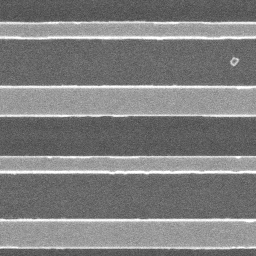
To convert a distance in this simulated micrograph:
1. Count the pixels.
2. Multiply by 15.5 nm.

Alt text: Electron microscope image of lines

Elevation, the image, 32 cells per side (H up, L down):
LLLLLLLLLLLLLLLLLLLLLLLLLLLLLLLL
LLLLLLLLLLLLLLLLLLLLLLLLLLLLLLLL
LLLLLLLLLLLLLLLLLLLLLLLLLLLLLLLL
HHHHHHHHHHHHHHHHHHHHHHHHHHHHHHHH
HHHHHHHHHHHHHHHHHHHHHHHHHHHHHHHH
LLLLLLLLLLLLLLLLLLLLLLLLLLLLLLLL
LLLLLLLLLLLLLLLLLLLLLLLLLLLLLLLL
LLLLLLLLLLLLLLLLLLLLLLLLLLLLLLLL
LLLLLLLLLLLLLLLLLLLLLLLLLLLLLLLL
LLLLLLLLLLLLLLLLLLLLLLLLLLLLLLLL
LLLLLLLLLLLLLLLLLLLLLLLLLLLLLLLL
HHHHHHHHHHHHHHHHHHHHHHHHHHHHHHHH
HHHHHHHHHHHHHHHHHHHHHHHHHHHHHHHH
HHHHHHHHHHHHHHHHHHHHHHHHHHHHHHHH
LLLLLLLHHLLLLLHLLLLLLLLLLLLLLLLL
LLLLLLLLLLLLLLLLLLLLLLLLLLLLLLLL
LLLLLLLLLLLLLLLLLLLLLLLLLLLLLLLL
LLLLLLLLLLLLLLLLLLLLLLLLLLLLLLLL
LLLLLLLLLLLLLLLLLLLLLLLLLLLLLLLL
LLLLLLLLLLLLLLLLLLLLLLLLLLLLLLLL
HHHHHHHHHHHHHHHHHHHHHHHHHHHHHHHH
LHHLHHHHHLLLHHHHHHHHHHHLHHHHHHHH
LLLLLLLLLLLLLLLLLLLLLLLLLLLLLLLL
LLLLLLLLLLLLLLLLLLLLLLLLLLLLLLLL
LLLLLLLLLLLLLLLLLLLLLLLLLLLLLLLL
LLLLLLLLLLLLLLLLLLLLLLLLLLLLLLLL
LLLLLLLLLLLLLLLLLLLLLLLLLLLLLLLL
LLLLLLLLLLLLLLLLLLLLLLLLLLLLLLLL
HHHHHHHHHHHHHHHHHHHHHHHHHHHHHHHH
HHHHHHHHHHHHHHHHHHHHHHHHHHHHHHHH
HHHHHHHHHHHHHHHHHHHHHHHHHHHHHHHH
LLLLLLLLLLLLLLLLLLLLLLLLLLLLLLLL